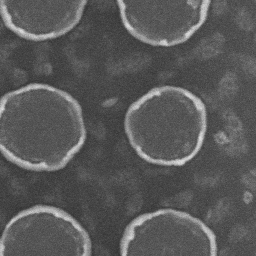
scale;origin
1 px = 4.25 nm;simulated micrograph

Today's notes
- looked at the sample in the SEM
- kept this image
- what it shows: raised bodies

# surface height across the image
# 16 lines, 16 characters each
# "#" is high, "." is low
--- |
#####...#####...
#####...#####...
.........##.....
................
................
.##.......#.....
#####...#####...
#####...#####...
#####...#####...
#####....###....
..##............
................
................
.###.....###....
#####...#####...
######..#####...